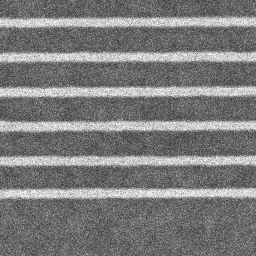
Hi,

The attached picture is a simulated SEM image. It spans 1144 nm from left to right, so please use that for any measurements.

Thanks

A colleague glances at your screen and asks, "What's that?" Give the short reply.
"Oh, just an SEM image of parallel lines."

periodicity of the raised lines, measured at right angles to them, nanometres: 153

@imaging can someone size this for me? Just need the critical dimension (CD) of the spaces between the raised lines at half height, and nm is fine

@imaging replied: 121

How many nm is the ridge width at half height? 35.7